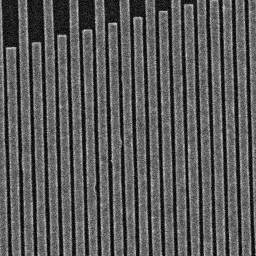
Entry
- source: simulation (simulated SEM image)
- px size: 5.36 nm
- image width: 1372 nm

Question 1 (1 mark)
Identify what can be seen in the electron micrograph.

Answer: parallel lines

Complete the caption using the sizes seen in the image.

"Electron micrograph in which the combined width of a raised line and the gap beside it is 68.5 nanometers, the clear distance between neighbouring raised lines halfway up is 22.8 nm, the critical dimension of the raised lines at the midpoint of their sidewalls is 45.6 nm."